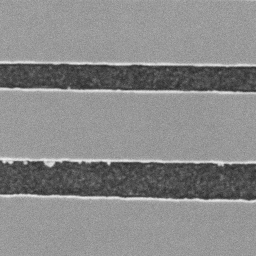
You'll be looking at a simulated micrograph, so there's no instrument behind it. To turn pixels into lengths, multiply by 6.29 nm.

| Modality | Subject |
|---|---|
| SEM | lines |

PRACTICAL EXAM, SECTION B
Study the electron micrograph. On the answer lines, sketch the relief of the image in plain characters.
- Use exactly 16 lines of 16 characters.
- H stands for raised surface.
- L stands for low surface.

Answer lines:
HHHHHHHHHHHHHHHH
HHHHHHHHHHHHHHHH
HHHHHHHHHHHHHHHH
HHHHHHHHHHHHHHHH
LLLLLLLLLLLLLLLL
LLLLLLLLLLLLLLLL
HHHHHHHHHHHHHHHH
HHHHHHHHHHHHHHHH
HHHHHHHHHHHHHHHH
HHHHHHHHHHHHHHHH
LLLLLLLLLLLLLLLL
LLLLLLLLLLLLLLLL
HHHHHHHHHHHHHHHL
HHHHHHHHHHHHHHHH
HHHHHHHHHHHHHHHH
HHHHHHHHHHHHHHHH